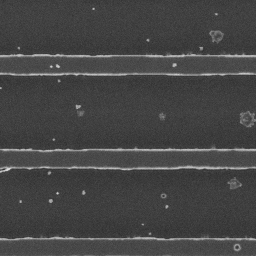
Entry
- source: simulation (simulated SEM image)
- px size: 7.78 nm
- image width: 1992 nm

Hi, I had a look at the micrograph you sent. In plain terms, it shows lines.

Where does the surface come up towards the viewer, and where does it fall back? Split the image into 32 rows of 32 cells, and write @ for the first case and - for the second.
--------------------------------
--------------------------------
--------------------------------
--------------------------------
--------------------------------
--------------------------------
--------------------------------
@@@@@@@@@@@@@@@@@@@@@@@@@@@@@@@@
@@@@@@@@@@@@@@@@@@@@@@@@@@@@@@@@
--------------------------------
--------------------------------
--------------------------------
--------------------------------
--------------------------------
--------------------------------
--------------------------------
--------------------------------
--------------------------------
--------------------------------
@@@@@@@@@@@@@@@@@@@@@@@@@@@@@@@@
@@@@@@@@@@@@@@@@@@@@@@@@@@@@@@@@
--------------------------------
--------------------------------
--------------------------------
--------------------------------
--------------------------------
--------------------------------
--------------------------------
--------------------------------
--------------------------------
@@@@@@@@@@@@@@@@@@@@@@@@@@@@@@@@
@@@@@@@@@@@@@@@@@@@@@@@@@@@@@@@@